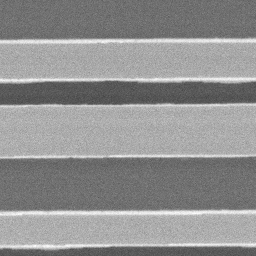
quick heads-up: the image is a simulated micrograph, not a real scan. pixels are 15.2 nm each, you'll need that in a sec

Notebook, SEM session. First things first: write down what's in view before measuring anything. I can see lines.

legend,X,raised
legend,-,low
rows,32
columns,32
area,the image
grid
--------------------------------
--------------------------------
--------------------------------
--------------------------------
--------------------------------
XXXXXXXXXXXXXXXXXXXXXXXXXXXXXXXX
XXXXXXXXXXXXXXXXXXXXXXXXXXXXXXXX
XXXXXXXXXXXXXXXXXXXXXXXXXXXXXXXX
XXXXXXXXXXXXXXXXXXXXXXXXXXXXXXXX
XXXXXXXXXXXXXXXXXXXXXXXXXXXXXXXX
--------------------------------
--------------------------------
--------------------------------
XXXXXXXXXXXXXXXXXXXXXXXXXXXXXXXX
XXXXXXXXXXXXXXXXXXXXXXXXXXXXXXXX
XXXXXXXXXXXXXXXXXXXXXXXXXXXXXXXX
XXXXXXXXXXXXXXXXXXXXXXXXXXXXXXXX
XXXXXXXXXXXXXXXXXXXXXXXXXXXXXXXX
XXXXXXXXXXXXXXXXXXXXXXXXXXXXXXXX
XXXXXXXXXXXXXXXX----X-----------
--------------------------------
--------------------------------
--------------------------------
--------------------------------
--------------------------------
--------------------------------
--------------------------------
XXXXXXXXXXXXXXXXXXXXXXXXXXXXXXXX
XXXXXXXXXXXXXXXXXXXXXXXXXXXXXXXX
XXXXXXXXXXXXXXXXXXXXXXXXXXXXXXXX
XXXXXXXXXXXXXXXXXXXXXXXXXXXXXXXX
--------------------------------